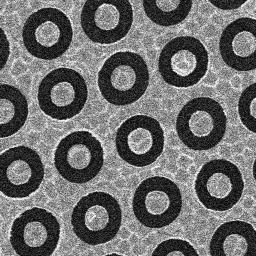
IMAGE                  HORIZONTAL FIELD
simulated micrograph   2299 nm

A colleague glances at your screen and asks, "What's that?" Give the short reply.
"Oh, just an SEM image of a regular array of ring-shaped grooves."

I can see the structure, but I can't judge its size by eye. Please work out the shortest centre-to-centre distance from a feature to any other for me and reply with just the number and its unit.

561 nm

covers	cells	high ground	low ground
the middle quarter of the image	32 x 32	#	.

##########....##.....###...#####
...######....####....###...#####
....#####...######...###....###.
.....###....######...####.......
.....###....######...####.......
##....###...#####....######.....
##....###.....##.....###########
###...###...........############
##....####.........#############
##....#####.......#############.
.....#########################..
....#########################...
...##########################...
..##############......######....
###############.........####...#
##############..........####...#
#############.....###....###....
#......######...######...###....
........#####...######...####...
.........####...######...#####..
..###....####...######...#####..
.#####....###....####....#######
.######...####....#.....########
.######...####.........#########
.#####....#####........#########
..####....#######....###########
.........#######################
.........#######################
.......##############.....######
##....#############.........####
###################.........####
##################...........###